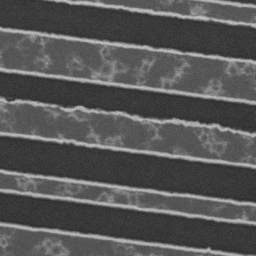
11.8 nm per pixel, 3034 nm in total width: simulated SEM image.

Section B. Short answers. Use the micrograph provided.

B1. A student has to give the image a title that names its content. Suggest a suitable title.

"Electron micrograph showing one or a few lines or trenches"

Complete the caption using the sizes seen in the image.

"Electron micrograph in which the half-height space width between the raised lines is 418 nm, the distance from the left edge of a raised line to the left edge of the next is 774 nanometres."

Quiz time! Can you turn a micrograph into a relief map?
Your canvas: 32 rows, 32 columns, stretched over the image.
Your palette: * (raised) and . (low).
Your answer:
............*****************...
...................*************
...........................*****
................................
******..........................
**************..................
**********************..........
*****************************...
********************************
......**************************
..............******************
......................**********
..............................**
********........................
****************................
***********************.........
*****************************...
.......*************************
..............******************
.....................***********
..............................**
................................
********........................
***************.................
......******************........
..............*****************.
......................**********
............................****
***.............................
**********......................
******************..............
***************************.....